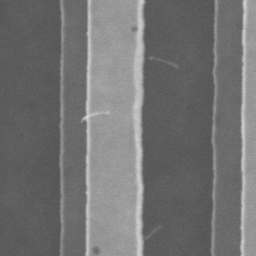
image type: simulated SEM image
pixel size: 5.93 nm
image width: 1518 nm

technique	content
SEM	lines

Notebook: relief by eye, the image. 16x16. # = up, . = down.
....#####....###
....#####....###
....#####....###
....#####....###
....#####....###
....#####....###
....#####....###
....#####....###
....#####....###
....#####....###
....#####....###
....#####....###
....#####....###
....#####....###
....#####....###
....#####....###